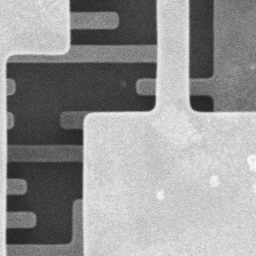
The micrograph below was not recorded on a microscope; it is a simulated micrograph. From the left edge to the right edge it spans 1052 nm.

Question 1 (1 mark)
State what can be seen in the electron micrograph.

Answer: wiring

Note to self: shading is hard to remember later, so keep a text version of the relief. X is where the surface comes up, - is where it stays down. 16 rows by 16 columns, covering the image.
XXXX------XX----
XXXX------XX----
XXXX------XX----
X---------XX----
----------XX----
----------XX----
----------XX----
-----XXXXXXXXXXX
-----XXXXXXXXXXX
-----XXXXXXXXXXX
-----XXXXXXXXXXX
-----XXXXXXXXXXX
-----XXXXXXXXXXX
-----XXXXXXXXXXX
-----XXXXXXXXXXX
-----XXXXXXXXXXX